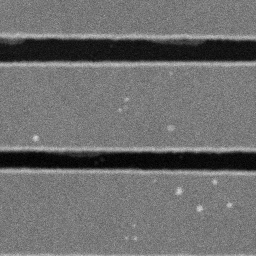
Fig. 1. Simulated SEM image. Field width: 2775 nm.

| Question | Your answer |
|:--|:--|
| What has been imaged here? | lines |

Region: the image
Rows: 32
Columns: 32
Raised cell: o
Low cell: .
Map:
oooooooooooooooooooooooooooooooo
oooooooooooooooooooooooooooooooo
oooooooooooooooooooooooooooooooo
oooooooooooooooooooooooooooooooo
oooooooooooooooooooooooooooooooo
................................
................................
................................
oooooooooooooooooooooooooooooooo
oooooooooooooooooooooooooooooooo
oooooooooooooooooooooooooooooooo
oooooooooooooooooooooooooooooooo
oooooooooooooooooooooooooooooooo
oooooooooooooooooooooooooooooooo
oooooooooooooooooooooooooooooooo
oooooooooooooooooooooooooooooooo
oooooooooooooooooooooooooooooooo
oooooooooooooooooooooooooooooooo
oooooooooooooooooooooooooooooooo
................................
................................
oooooooooooooooooooooooooooooooo
oooooooooooooooooooooooooooooooo
oooooooooooooooooooooooooooooooo
oooooooooooooooooooooooooooooooo
oooooooooooooooooooooooooooooooo
oooooooooooooooooooooooooooooooo
oooooooooooooooooooooooooooooooo
oooooooooooooooooooooooooooooooo
oooooooooooooooooooooooooooooooo
oooooooooooooooooooooooooooooooo
oooooooooooooooooooooooooooooooo